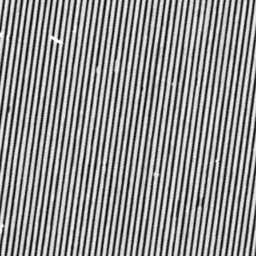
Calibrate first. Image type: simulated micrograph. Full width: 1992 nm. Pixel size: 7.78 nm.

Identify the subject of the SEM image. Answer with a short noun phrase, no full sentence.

parallel lines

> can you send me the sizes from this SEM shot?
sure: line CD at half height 27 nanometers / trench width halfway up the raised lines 2.61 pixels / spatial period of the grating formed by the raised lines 45.9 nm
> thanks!